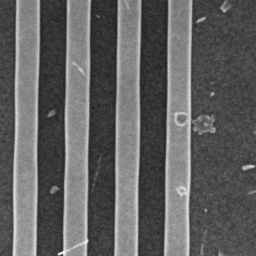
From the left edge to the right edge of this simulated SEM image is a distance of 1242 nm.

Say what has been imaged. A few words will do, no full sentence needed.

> groups of lines, slits or small figures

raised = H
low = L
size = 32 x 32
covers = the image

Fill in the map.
LLHHHLLLHHHLLLLHHHLLLHHHLLLLLLLL
LLHHHLLLHHHLLLLHHHLLLHHHLLLLLLLL
LLHHHLLLHHHLLLLHHHLLLHHHLLLLLLLL
LLHHHLLLHHHLLLLHHHLLLHHHLLLLLLLL
LLHHHLLLHHHLLLLHHHLLLHHHLLLLLLLL
LLHHHLLLHHHLLLLHHHLLLHHHLLLLLLLL
LLHHHLLLHHHLLLLHHHLLLHHHLLLLLLLL
LLHHHLLLHHHLLLLHHLLLLHHHLLLLLLLL
LLHHHLLLHHHLLLLHHLLLLHHHLLLLLLLL
LLHHHLLLHHHLLLLHHLLLLHHHLLLLLLLL
LLHHHLLLHHHLLLLHHLLLLHHHLLLLLLLL
LLHHHLLLHHHLLLLHHLLLLHHHLLLLLLLL
LLHHHLLLHHHLLLLHHLLLLHHHLLLLLLLL
LLHHHLLLHHHLLLLHHLLLLHHHLLLLLLLL
LLHHHLLLHHHLLLLHHLLLLHHHLLLLLLLL
LLHHHLLLHHHLLLLHHLLLLHHHLLLLLLLL
LLHHHLLLHHHLLLLHHLLLLHHHLLLLLLLL
LLHHHLLLHHHLLLLHHLLLLHHHLLLLLLLL
LLHHHLLLHHHLLLLHHLLLLHHHLLLLLLLL
LLHHHLLLHHHLLLHHHLLLLHHHLLLLLLLL
LLHHHLLLHHHLLLHHHLLLLHHHLLLLLLLL
LLHHHLLLHHHLLLHHHLLLLHHHLLLLLLLL
LLHHHLLLHHHLLLLHHLLLLHHHLLLLLLLL
LLHHHLLLHHHLLLLHHLLLLHHHLLLLLLLL
LLHHHLLLHHHLLLHHHLLLLHHHLLLLLLLL
LLHHHLLLHHHLLLHHHLLLLHHHLLLLLLLL
LLHHHLLLHHHLLLHHHLLLLHHHLLLLLLLL
LLHHHLLLHHHLLLHHHLLLLHHHLLLLLLLL
LLHHHLLLHHHLLLHHHLLLLHHHLLLLLLLL
LLHHHLLLHHHLLLHHHLLLLHHHLLLLLLLL
LLHHHLLLHHHLLLHHHLLLLHHHLLLLLLLL
LLHHHLLLHHHLLLHHHLLLLHHHLLLLLLLL